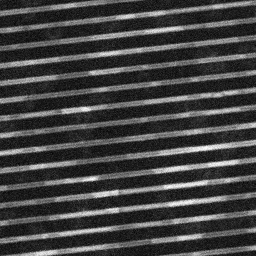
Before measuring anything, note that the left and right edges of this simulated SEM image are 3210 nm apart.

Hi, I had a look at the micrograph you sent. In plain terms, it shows parallel lines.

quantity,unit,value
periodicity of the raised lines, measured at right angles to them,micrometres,0.218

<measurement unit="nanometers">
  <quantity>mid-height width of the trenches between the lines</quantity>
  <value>167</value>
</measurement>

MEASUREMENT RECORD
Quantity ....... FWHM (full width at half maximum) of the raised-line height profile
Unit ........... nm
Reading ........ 51.4